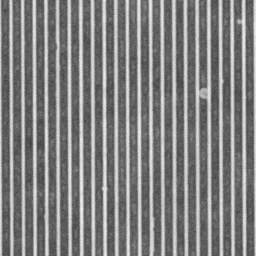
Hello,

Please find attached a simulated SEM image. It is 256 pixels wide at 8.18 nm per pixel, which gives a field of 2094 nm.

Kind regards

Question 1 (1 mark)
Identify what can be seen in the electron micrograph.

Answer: parallel lines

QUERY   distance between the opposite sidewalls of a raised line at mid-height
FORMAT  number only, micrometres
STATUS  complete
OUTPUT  0.0225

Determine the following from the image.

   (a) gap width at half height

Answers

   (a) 74.7 nanometers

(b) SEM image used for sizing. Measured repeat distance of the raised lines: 11.7 px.